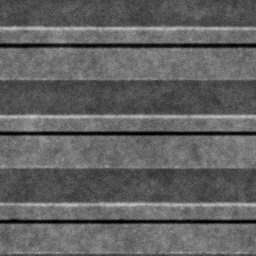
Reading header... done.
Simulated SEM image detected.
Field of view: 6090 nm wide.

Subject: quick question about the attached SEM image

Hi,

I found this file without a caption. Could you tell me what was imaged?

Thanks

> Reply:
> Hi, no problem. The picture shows lines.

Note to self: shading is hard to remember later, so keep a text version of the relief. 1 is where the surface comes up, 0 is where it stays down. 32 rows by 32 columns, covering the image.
00000000000000000000000000000000
00000000000000000000000000000000
00000000000000000000000000000000
00000000000000000000000000000000
11111111111111111111111111111111
11111111111111111111111111111111
11111111111111111111111111111111
11111111111111111111111111111111
11111111111111111111111111111111
11111111111111111111111111111111
00000000000000000000000000000000
00000000000000000000000000000000
00000000000000000000000000000000
00000000000000000000000000000000
00000000000000000000000000000000
11111111111111111111111111111111
11111111111111111111111111111111
11111111111111111111111111111111
11111111111111111111111111111111
11111111111111111111111111111111
11111111111111111111111111111111
00000000000000000000000000000000
00000000000000000000000000000000
00000000000000000000000000000000
00000000000000000000000000000000
00000000000000000000000000000000
11111111111111111111111111111111
11111111111111111111111111111111
11111111111111111111111111111111
11111111111111111111111111111111
11111111111111111111111111111111
10011001101101011111100111111111